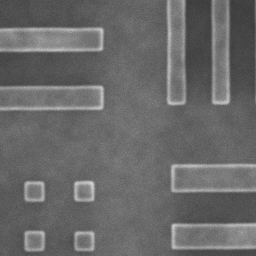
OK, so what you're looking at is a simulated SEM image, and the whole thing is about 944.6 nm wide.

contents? groups of lines, slits or small figures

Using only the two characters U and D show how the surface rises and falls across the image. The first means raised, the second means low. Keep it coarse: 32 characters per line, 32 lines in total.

DDDDDDDDDDDDDDDDDDDDDUUDDDUUUDDD
DDDDDDDDDDDDDDDDDDDDDUUDDDUUUDDD
DDDDDDDDDDDDDDDDDDDDDUUDDDUUUDDD
DDDDDDDDDDDDDDDDDDDDDUUDDDDUUDDD
UUUUUUUUUUUUUDDDDDDDDUUDDDDUUDDD
UUUUUUUUUUUUUDDDDDDDDUUDDDDUUDDD
DDDDDDDDDDDDDDDDDDDDDUUDDDDUUDDD
DDDDDDDDDDDDDDDDDDDDDUUDDDDUUDDD
DDDDDDDDDDDDDDDDDDDDDUUDDDDUUDDD
DDDDDDDDDDDDDDDDDDDDDUUDDDDUUDDD
DDDDDDDDDDDDDDDDDDDDDUUDDDDUUDDD
UUUUUUUUUUUUUDDDDDDDDUUDDDDUUDDD
UUUUUUUUUUUUUDDDDDDDDUUDDDDUUDDD
UUUUUUUUUUUUUDDDDDDDDDDDDDDDDDDD
DDDDDDDDDDDDDDDDDDDDDDDDDDDDDDDD
DDDDDDDDDDDDDDDDDDDDDDDDDDDDDDDD
DDDDDDDDDDDDDDDDDDDDDDDDDDDDDDDD
DDDDDDDDDDDDDDDDDDDDDDDDDDDDDDDD
DDDDDDDDDDDDDDDDDDDDDDDDDDDDDDDD
DDDDDDDDDDDDDDDDDDDDDDDDDDDDDDDD
DDDDDDDDDDDDDDDDDDDDDDDDDDDDDDDD
DDDDDDDDDDDDDDDDDDDDDDUUUUUUUUUU
DDDDDDDDDDDDDDDDDDDDDDUUUUUUUUUU
DDDUUDDDDUUUDDDDDDDDDDUUUUUUUUUU
DDDUUDDDDUUUDDDDDDDDDDDDDDDDDDDD
DDDDDDDDDDDDDDDDDDDDDDDDDDDDDDDD
DDDDDDDDDDDDDDDDDDDDDDDDDDDDDDDD
DDDDDDDDDDDDDDDDDDDDDDDDDDDDDDDD
DDDDDDDDDDDDDDDDDDDDDDUUUUUUUUUU
DDDUUDDDDUUUDDDDDDDDDDUUUUUUUUUU
DDDUUDDDDUUUDDDDDDDDDDUUUUUUUUUU
DDDDDDDDDDDDDDDDDDDDDDDDDDDDDDDD